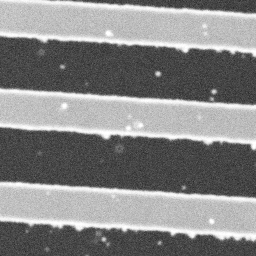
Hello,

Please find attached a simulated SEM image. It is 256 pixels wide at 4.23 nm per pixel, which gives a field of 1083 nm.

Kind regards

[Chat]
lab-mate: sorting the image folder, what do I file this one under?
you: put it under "lines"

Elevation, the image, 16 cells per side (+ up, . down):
++++++++++......
++++++++++++++++
....++++++++++++
................
................
................
++++++++++++++..
++++++++++++++++
.........+++++++
................
................
++..............
++++++++++++++++
++++++++++++++++
...........+++++
................